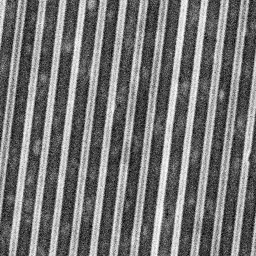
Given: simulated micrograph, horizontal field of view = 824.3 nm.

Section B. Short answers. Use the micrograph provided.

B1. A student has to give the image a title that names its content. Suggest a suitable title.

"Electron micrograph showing parallel lines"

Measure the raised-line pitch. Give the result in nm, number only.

64.6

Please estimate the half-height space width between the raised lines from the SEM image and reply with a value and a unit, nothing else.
44.3 nm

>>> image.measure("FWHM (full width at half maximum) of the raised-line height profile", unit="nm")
20.8